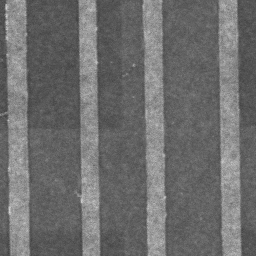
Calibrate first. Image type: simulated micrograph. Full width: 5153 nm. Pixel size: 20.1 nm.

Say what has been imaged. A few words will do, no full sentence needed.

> one or a few lines or trenches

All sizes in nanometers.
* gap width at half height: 981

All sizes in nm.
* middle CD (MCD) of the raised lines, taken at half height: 340